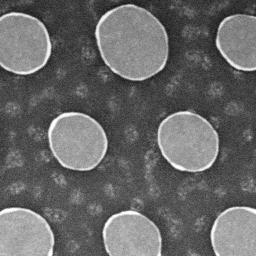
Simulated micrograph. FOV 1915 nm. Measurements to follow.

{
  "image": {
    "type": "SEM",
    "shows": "raised bodies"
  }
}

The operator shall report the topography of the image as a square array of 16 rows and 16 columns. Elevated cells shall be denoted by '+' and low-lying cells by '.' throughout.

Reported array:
.......++.......
+++...++++....++
+++...++++....++
+++...++++....++
.+.....+++......
................
................
....++....+++...
...++++...++++..
...++++...++++..
....++.....++...
................
................
++.....++.....++
+++....+++...+++
+++....+++...+++